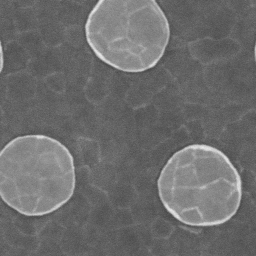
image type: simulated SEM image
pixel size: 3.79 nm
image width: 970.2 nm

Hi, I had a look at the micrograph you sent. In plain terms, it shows raised bodies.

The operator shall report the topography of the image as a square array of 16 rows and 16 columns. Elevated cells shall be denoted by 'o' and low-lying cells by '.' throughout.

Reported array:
......oooo......
.....ooooo......
......oooo......
......oooo......
................
................
................
................
................
oooo.......ooo..
ooooo.....ooooo.
ooooo.....ooooo.
oooo......ooooo.
...........ooo..
................
................